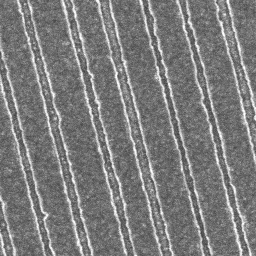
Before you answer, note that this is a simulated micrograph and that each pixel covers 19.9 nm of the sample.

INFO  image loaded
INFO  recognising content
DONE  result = parallel lines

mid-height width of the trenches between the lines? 160 nanometres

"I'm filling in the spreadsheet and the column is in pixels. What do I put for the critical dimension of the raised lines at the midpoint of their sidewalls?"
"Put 30.3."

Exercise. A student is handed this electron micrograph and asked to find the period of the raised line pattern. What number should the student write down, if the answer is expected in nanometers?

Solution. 762